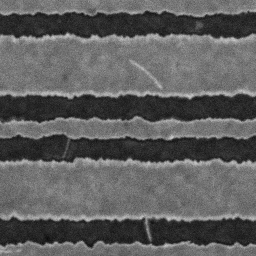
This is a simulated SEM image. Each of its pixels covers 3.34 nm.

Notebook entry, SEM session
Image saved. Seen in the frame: lines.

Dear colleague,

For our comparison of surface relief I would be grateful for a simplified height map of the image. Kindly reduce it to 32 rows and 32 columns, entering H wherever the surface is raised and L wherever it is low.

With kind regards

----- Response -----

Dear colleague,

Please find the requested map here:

HHHHHHHHHHHHHHHHHHHHHHHHHHHHHHHH
HHHHHHHHLHHHHHHLHHLHLHHHHHHHHHLL
LLLLLLLLLLLLLLLLLLLLLLLLLLLLLLLL
LLLLLLLLLLLLLLLLLLLLLLLLLLLLLLLL
LLLLLLLHHLLLLLLLLLHHLHHLHLLLLLLH
HHHHHHHHHHHHHHHHHHHHHHHHHHHHHHHH
HHHHHHHHHHHHHHHHHHHHHHHHHHHHHHHH
HHHHHHHHHHHHHHHHHHHHHHHHHHHHHHHH
HHHHHHHHHHHHHHHHHHHHHHHHHHHHHHHH
HHHHHHHHHHHHHHHHHHHHHHHHHHHHHHHH
HHHHHHHHHHHHHHHHHHHHHHHHHHHHHHHH
HHHHHHHHHHHHHHHHHHHHHHHHHHHHHHHH
LLLLLLLLLLLLLLLLLLLLLLLLLLLLLLLL
LLLLLLLLLLLLLLLLLLLLLLLLLLLLLLLL
LLLLLLLLLLLLLLLLLLLLLLLLLLLLLLLL
HHHHHHHHHHHHHHHHHHHHHHHHHHHHHHHH
HHHHHHHHHHHHHHHHHHHHHHHHHHHHHHHH
LLLLLLLLLLLLLLLLLLLLLLLLLLLLLLLL
LLLLLLLLLLLLLLLLLLLLLLLLLLLLLLLL
LLLLLLLLLLLLLLLLLLLLLLLLLLLLLLLL
HHHHHHHHHHHHHHHHHHHHHHHHHHHHHHHH
HHHHHHHHHHHHHHHHHHHHHHHHHHHHHHHH
HHHHHHHHHHHHHHHHHHHHHHHHHHHHHHHH
HHHHHHHHHHHHHHHHHHHHHHHHHHHHHHHH
HHHHHHHHHHHHHHHHHHHHHHHHHHHHHHHH
HHHHHHHHHHHHHHHHHHHHHHHHHHHHHHHH
HHHHHHHHHHHHHHHHHHHHHHHHHHHHHHHH
LLLLLLLLLLLLLLLLLLLLLLLLLLLLLLLL
LLLLLLLLLLLLLLLLLLLLLLLLLLLLLLLL
LLLLLLLLLLLLLLLLLLLLLLLLLLLLLLLL
LLLHHLHHHHHLHLHLHHLLLLHHLLHLLLLL
HHHHHHHHHHHHHHHHHHHHHHHHHHHHHHHH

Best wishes